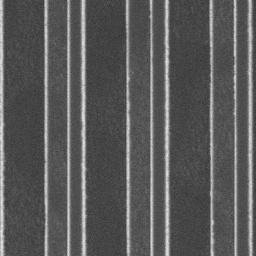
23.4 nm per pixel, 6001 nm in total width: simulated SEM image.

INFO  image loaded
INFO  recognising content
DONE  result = lines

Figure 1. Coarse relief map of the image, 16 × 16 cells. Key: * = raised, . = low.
...**...**...***
...**...**...***
...**...**...***
...**...**...***
...**...**...***
...**...**...***
...**...**...***
...**...**...***
...**...**...***
...**...**...***
...**...**...***
...**...**...***
...**...**...***
...**...**...***
...**...**...***
...**...**...***